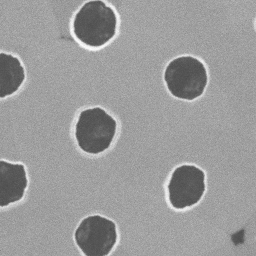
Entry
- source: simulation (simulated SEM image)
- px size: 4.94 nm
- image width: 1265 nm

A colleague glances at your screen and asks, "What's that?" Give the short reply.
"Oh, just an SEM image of holes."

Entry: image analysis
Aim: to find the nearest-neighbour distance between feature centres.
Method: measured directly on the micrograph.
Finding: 478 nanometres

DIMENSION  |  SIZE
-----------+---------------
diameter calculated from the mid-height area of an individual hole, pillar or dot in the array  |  214 nm